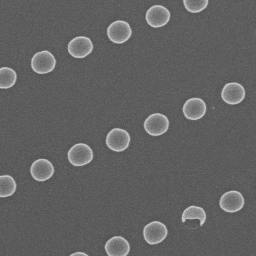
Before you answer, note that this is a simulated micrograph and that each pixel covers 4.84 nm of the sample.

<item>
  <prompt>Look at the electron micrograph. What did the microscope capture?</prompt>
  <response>a regular array of raised bodies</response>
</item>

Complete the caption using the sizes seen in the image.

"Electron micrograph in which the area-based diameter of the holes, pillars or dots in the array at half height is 108 nm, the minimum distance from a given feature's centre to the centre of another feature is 199 nanometers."